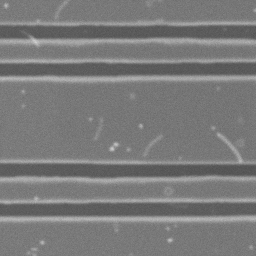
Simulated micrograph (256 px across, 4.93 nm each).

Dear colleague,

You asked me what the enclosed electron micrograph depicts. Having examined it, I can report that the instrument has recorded lines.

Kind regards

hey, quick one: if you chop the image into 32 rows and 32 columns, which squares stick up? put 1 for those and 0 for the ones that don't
11111111111111111111111111111111
11111111111111111111111111111111
11111111111111111111111111111111
00000000000000000000000000000000
00000000000000000000000000000000
11111111111111111111111111111111
11111111111111111111111111111111
11111111111111111111111111111111
00000000000000000000000000000000
00000000000000000000000000000000
11111111111111111111111111111111
11111111111111111111111111111111
11111111111111111111111111111111
11111111111111111111111111111111
11111111111111111111111111111111
11111111111111111111111111111111
11111111111111111111111111111111
11111111111111111111111111111111
11111111111111111111111111111111
11111111111111111111111111111111
00000000000000000000000000000000
00000000000000000000000000000000
11111111111111111111111111111111
11111111111111111111111111111111
11111111111111111111111111111111
00000000000000000000000000000000
00000000000000000000000000000000
11111111111111111111111111111111
11111111111111111111111111111111
11111111111111111111111111111111
11111111111111111111111111111111
11111111111111111111111111111111